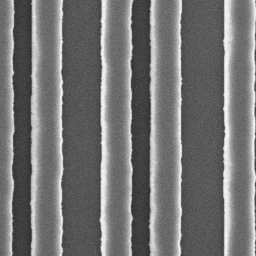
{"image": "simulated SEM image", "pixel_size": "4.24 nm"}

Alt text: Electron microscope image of lines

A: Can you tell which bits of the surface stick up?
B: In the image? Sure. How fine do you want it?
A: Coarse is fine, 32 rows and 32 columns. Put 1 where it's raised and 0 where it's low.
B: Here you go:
11001111000001111001111000001111
11001111000001110001111000001111
11001111000001110001111000001111
11001111000001110001111000001111
11001111000001110001111000001111
11001111000001110001111000001111
11001111000001110001111000001111
11001111000001110001111000001111
11001111000001110001111000001111
11001111000001110001111000001111
11001111000001110001111000001111
11001111000001110001111000001111
11001111000001110001111000001111
11001111000001110001111000001111
11001111000001110001111000001111
11001111000001110001111000001111
11001111000001110001111000001111
11001111000001110001111000001111
11001111000001110001111000001111
11001111000001110001111000001111
11001111000001110001111000001111
10001111000001111001111000001111
11001111000001110001111000001111
11001111000001110001111000001111
11001111000001110001111000001111
10001111000001110001111000001111
10001111000001110001111000001111
10001111000001111001111000001111
11001111000001110001111000001111
10001111000001110001111000001111
10001111000001110001110000001111
10001111000001110001111000001111